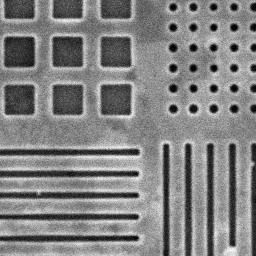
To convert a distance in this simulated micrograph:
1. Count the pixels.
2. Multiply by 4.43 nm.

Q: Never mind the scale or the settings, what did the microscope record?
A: groups of lines, slits or small figures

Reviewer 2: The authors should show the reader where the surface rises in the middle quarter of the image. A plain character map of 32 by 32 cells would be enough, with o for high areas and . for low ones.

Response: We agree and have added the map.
.....oooo........ooooooooo..ooo.
oooooooooooooooooooooooooo..ooo.
oooooooooooooooooooooooooooooooo
oooooooooooooooooooooooooooooooo
oooooooooooooooooooooooooooooooo
.....oooo........ooooooooo..ooo.
.....oooo........ooooooooo..ooo.
.....oooo........ooooooooooooooo
.....oooo........ooooooooooooooo
.....oooo........ooooooooooooooo
.....oooo........ooooooooo..ooo.
.....oooo........ooooooooo...oo.
.....oooo........oooooooooo.oooo
oooooooooooooooooooooooooooooooo
oooooooooooooooooooooooooooooooo
oooooooooooooooooooooooooooooooo
oooooooooooooooooooooooooooooooo
oooooooooooooooooooooooooooooooo
oooooooooooooooooooooooooooooooo
oooooooooooooooooooooooooooooooo
oooooooooooooooooooooooo..oooo..
...................ooooo...ooo..
...................ooooo...ooo..
oooooooooooooooooooooooo...ooo..
oooooooooooooooooooooooo...ooo..
oooooooooooooooooooooooo...ooo..
..................oooooo...ooo..
...................ooooo...ooo..
..............oooooooooo...ooo..
oooooooooooooooooooooooo...ooo..
oooooooooooooooooooooooo..oooo..
oooooooooooooooooooooooo..oooo..